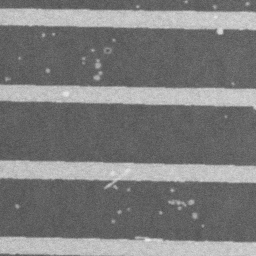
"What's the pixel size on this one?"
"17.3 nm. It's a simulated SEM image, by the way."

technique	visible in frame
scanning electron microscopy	lines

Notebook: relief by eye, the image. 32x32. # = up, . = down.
................................
#######################.........
################################
.......................#########
................................
................................
................................
................................
................................
................................
................................
################################
################################
................................
................................
................................
................................
................................
................................
................................
################................
################################
..............#....#############
................................
................................
................................
................................
................................
................................
................................
################################
################################